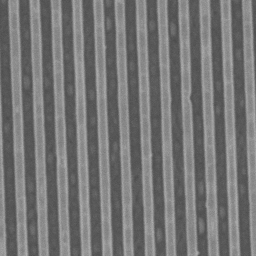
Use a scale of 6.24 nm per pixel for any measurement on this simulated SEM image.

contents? parallel lines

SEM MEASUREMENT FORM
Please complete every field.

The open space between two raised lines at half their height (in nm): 74.8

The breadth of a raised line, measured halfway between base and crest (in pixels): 9.25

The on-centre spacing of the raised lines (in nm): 132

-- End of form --